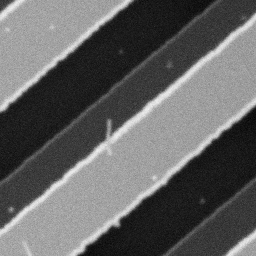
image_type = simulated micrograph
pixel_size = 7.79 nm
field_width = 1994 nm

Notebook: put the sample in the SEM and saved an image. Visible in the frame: lines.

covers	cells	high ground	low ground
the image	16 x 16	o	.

oooooooo.....ooo
oooooo......oooo
ooooo......ooooo
oooo.....ooooooo
ooo.....oooooooo
oo.....ooooooooo
o.....oooooooooo
.....oooooooooo.
....oooooooooo..
..ooooooooooo...
.oooooooooo.....
oooooooooo......
ooooooooo.....oo
oooooooo.....ooo
ooooooo.....oooo
ooooo......ooooo